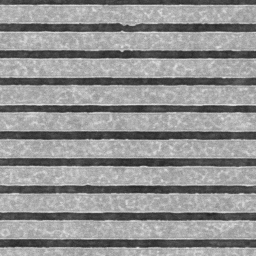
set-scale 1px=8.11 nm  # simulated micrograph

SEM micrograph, parallel lines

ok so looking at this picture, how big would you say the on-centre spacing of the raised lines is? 219 nanometres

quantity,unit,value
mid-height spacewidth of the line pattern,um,0.0689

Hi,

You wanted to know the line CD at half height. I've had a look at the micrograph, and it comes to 0.151 micrometres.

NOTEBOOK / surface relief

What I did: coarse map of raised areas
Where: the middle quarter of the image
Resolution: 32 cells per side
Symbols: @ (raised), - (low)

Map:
@@@@@@@@@@@@@@@@@@@@@@@@@@@@@@@@
@@@@@@@@@@@@@@@@@@@@@@@@@@@@@@@@
@@@@@@@@@@@@@@@@@@@@@@@@@@@@@@@@
--------------------------------
--------------------------------
-@@@-------@@@-----@@@------@@@-
@@@@@@@@@@@@@@@@@@@@@@@@@@@@@@@@
@@@@@@@@@@@@@@@@@@@@@@@@@@@@@@@@
@@@@@@@@@@@@@@@@@@@@@@@@@@@@@@@@
@@@@@@@@@@@@@@@@@@@@@@@@@@@@@@@@
--------------------------------
--------------------------------
@@@@@@@@@@@@@@@@@@@@@@@@@@@@@@@@
@@@@@@@@@@@@@@@@@@@@@@@@@@@@@@@@
@@@@@@@@@@@@@@@@@@@@@@@@@@@@@@@@
@@@@@@@@@@@@@@@@@@@@@@@@@@@@@@@@
@@@@@@@@@@@@@@@@@@@@@@@@@@@@@@@@
--------------------------------
--------------------------------
@@@@@@@@@@@@@@@@@@@@@@@@@@@@@@@@
@@@@@@@@@@@@@@@@@@@@@@@@@@@@@@@@
@@@@@@@@@@@@@@@@@@@@@@@@@@@@@@@@
@@@@@@@@@@@@@@@@@@@@@@@@@@@@@@@@
--------------------------------
--------------------------------
--------------------------------
@@@@@@@@@@@@@@@@@@@@@@@@@@@@@@@@
@@@@@@@@@@@@@@@@@@@@@@@@@@@@@@@@
@@@@@@@@@@@@@@@@@@@@@@@@@@@@@@@@
@@@@@@@@@@@@@@@@@@@@@@@@@@@@@@@@
--------------------------------
--------------------------------